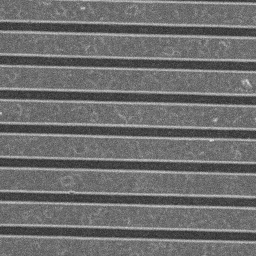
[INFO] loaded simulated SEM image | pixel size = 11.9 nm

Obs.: parallel lines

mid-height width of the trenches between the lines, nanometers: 125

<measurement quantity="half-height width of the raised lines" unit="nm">286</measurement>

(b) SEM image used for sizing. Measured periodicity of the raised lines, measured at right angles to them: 0.406 microns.